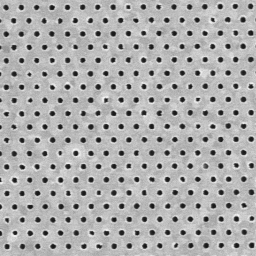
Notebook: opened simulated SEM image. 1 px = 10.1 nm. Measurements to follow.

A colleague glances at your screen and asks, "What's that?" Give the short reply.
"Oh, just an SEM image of a regular array of holes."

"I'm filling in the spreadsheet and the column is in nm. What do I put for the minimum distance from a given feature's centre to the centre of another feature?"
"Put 150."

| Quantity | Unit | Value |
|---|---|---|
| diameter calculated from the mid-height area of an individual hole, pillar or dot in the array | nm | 57.9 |